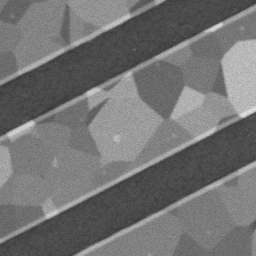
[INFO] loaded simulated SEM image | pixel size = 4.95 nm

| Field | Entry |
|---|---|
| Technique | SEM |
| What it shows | one or a few lines or trenches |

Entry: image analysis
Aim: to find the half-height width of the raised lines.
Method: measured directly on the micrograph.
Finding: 452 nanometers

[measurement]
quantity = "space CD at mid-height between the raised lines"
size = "241 nanometers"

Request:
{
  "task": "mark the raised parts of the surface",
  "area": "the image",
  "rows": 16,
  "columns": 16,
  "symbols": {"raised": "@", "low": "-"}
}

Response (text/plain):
@@@@@@@@@-------
@@@@@@@-------@@
@@@@@-------@@@@
@@@-------@@@@@@
@-------@@@@@@@@
------@@@@@@@@@@
----@@@@@@@@@@@@
--@@@@@@@@@@@@@-
@@@@@@@@@@@@@---
@@@@@@@@@@@-----
@@@@@@@@@------@
@@@@@@@-------@@
@@@@@-------@@@@
@@@-------@@@@@@
@-------@@@@@@@@
------@@@@@@@@@@